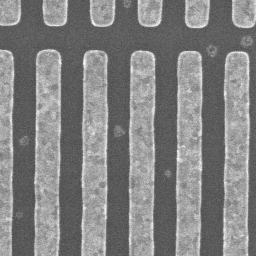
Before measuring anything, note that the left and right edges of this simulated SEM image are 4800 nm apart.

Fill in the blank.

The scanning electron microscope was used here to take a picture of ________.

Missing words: wiring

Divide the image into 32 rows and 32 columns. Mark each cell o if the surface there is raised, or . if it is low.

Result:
ooo..ooo...ooo...ooo...ooo...ooo
ooo..ooo...ooo...ooo...ooo...ooo
oo....oo...ooo...ooo...ooo...ooo
................................
................................
................................
o....oo....oo....oo....oo.......
oo...ooo..ooo...ooo...ooo...ooo.
oo...ooo..ooo...ooo...ooo...ooo.
oo...ooo..ooo...ooo...ooo...ooo.
oo...ooo..ooo...ooo...ooo...ooo.
oo...ooo..ooo...ooo...ooo...ooo.
o....ooo..ooo...ooo...ooo...ooo.
o....ooo..ooo...ooo...ooo...ooo.
o....ooo..ooo...ooo...ooo...ooo.
o....ooo..ooo...ooo...ooo...ooo.
o....ooo..ooo...ooo...ooo...ooo.
o....oo...ooo...ooo...ooo...ooo.
o...ooo...ooo...ooo...ooo...ooo.
o...ooo...ooo...ooo...ooo...ooo.
o...ooo...ooo...ooo...ooo...ooo.
o...ooo...ooo...ooo...ooo...ooo.
o...ooo...ooo...ooo...ooo...ooo.
o...ooo...ooo...ooo...ooo...ooo.
o...ooo...ooo...ooo...ooo...ooo.
o...ooo...ooo...ooo...ooo...ooo.
o...ooo...ooo...ooo...ooo...ooo.
o...ooo...ooo...ooo...ooo...ooo.
o...ooo...ooo...ooo...ooo...ooo.
o...ooo...ooo...ooo...ooo...ooo.
o...ooo...ooo...ooo...ooo...ooo.
o...ooo...ooo...ooo...ooo...ooo.